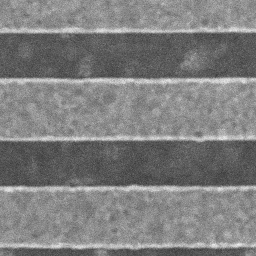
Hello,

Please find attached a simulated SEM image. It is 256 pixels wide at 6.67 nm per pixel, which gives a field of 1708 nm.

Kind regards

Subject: one or a few lines or trenches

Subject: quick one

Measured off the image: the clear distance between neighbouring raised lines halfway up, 0.319 microns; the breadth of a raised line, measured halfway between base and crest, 396 nm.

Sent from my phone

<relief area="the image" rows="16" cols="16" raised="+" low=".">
++++++++++++++++
++++++++++++++++
................
................
................
++++++++++++++++
++++++++++++++++
++++++++++++++++
++++++++++++++++
................
................
................
++++++++++++++++
++++++++++++++++
++++++++++++++++
................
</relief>